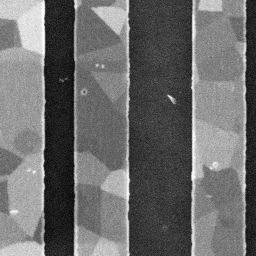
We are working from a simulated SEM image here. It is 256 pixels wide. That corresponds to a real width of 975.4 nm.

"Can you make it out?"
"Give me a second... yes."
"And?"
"lines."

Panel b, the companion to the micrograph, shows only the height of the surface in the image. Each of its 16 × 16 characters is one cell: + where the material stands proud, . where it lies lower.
+++..+++....+++.
+++..+++....+++.
+++..+++....+++.
+++..+++....+++.
+++..+++....+++.
+++..+++....+++.
+++..+++....+++.
+++..+++....+++.
+++..+++....+++.
+++..+++....+++.
+++..+++....+++.
+++..+++....+++.
+++..+++....+++.
+++..+++....+++.
+++..+++....+++.
+++..+++....+++.